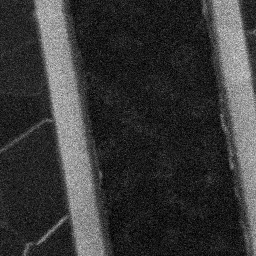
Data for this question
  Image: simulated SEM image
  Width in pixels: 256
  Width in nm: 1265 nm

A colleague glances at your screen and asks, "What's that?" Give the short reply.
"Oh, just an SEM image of one or a few lines or trenches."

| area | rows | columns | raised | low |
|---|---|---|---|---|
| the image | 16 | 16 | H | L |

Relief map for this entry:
HHHLLLLLLLLLLLHH
HHHLLLLLLLLLLLHH
HHHLLLLLLLLLLLLH
HHHHLLLLLLLLLLLH
HHHHLLLLLLLLLLLH
HHHHLLLLLLLLLLLH
HHHHLLLLLLLLLLLH
HHHHLLLLLLLLLLLH
HHHHLLLLLLLLLLLL
HHHHHLLLLLLLLLLL
HHHHHLLLLLLLLLLL
HHHHHLLLLLLLLLLL
HHHHHLLLLLLLLLLL
HHHHHLLLLLLLLLLL
HHHHHLLLLLLLLLLL
HHHHHHLLLLLLLLLL